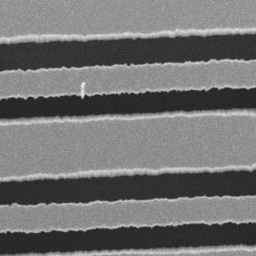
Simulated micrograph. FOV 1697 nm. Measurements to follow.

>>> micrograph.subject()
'lines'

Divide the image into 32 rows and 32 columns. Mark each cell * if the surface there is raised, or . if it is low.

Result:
********************************
********************************
********************************
********************************
********************............
................................
................................
............................*...
........************************
********************************
********************************
******************..............
................................
................................
.............*******************
********************************
********************************
********************************
********************************
********************************
********************************
***********************.........
**..............................
................................
................................
......**************************
********************************
********************************
***************.................
................................
................................
............********************